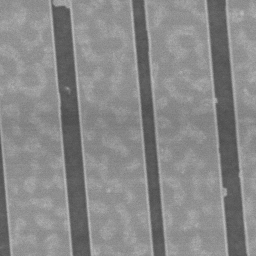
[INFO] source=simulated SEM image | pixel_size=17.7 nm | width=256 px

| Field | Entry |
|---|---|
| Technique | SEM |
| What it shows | one or a few lines or trenches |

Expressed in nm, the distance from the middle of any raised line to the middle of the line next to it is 1350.